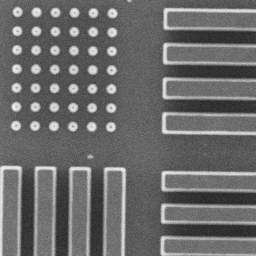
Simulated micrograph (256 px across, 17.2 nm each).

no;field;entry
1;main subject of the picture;groups of lines, slits or small figures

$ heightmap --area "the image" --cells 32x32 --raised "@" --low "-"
--------------------------------
----@----@-@---------@@@@@@@@@@@
---------------------@@@@@@@@@@@
----------------------@@@@@@@@@@
--------------------------------
--------------------------------
-----------@---------@@@@@@@@@@@
---------------------@@@@@@@@@@@
----@---------------------------
--------------------------------
---------------------@@@@@@@@@@@
---------------------@@@@@@@@@@@
--------------------------------
----@---------------------------
---------------------@@@@@@@@@@@
---------------------@@@@@@@@@@@
---------------------@@@@@@@@@@@
--------------------------------
--------------------------------
--------------------------------
--------------------------------
@@@--@@--@@--@@@----------------
@@@-@@@--@@--@@@----@@@@@@@@@@@@
@@--@@@--@@--@@------@@@@@@@@@@@
@@--@@@--@@--@@-----------------
@@--@@@--@@--@@-----------------
@@--@@@--@@--@@-----@@@@@@@@@@@@
@@--@@@--@@--@@-----@@@@@@@@@@@@
@@--@@@--@@--@@-----------------
@@--@@@--@@--@@-----------------
@@--@@@--@@--@@-----@@@@@@@@@@@@
@@--@@@--@@--@@-----@@@@@@@@@@@@